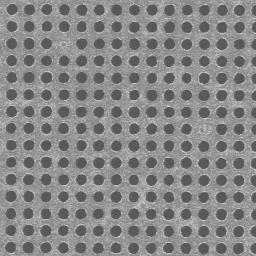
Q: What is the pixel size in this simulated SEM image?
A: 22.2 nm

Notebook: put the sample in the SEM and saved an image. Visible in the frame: a regular array of holes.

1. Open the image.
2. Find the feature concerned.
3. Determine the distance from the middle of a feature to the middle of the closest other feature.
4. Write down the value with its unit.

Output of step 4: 374 nm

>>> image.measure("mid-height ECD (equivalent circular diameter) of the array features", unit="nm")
249